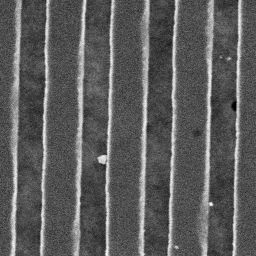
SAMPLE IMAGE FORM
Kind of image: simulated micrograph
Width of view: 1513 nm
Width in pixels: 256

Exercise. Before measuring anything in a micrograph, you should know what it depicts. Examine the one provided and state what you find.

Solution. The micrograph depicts lines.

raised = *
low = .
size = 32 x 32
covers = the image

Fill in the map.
**....*****...****....*****...**
**....*****...****....****....**
**....****....****....****....**
**....****....****....****....**
**....****....****....****....**
**....****....****....****....**
**....****....****....****....**
**....****....****....****....**
**....****....****....****....**
**....****....****....****....**
**....****....****....****....**
**....****....****....****....**
**....****....****....****....**
**....****....****....****....**
**...*****....****....****....**
**...*****....****....****....**
**...*****....****....****....**
**...*****....****....****....**
**...*****...*****....****...***
**...*****...*****...*****...***
**...*****...*****...*****...***
**...*****...*****...*****...***
**...*****...*****...*****...***
**...*****...*****...*****...***
**...*****...*****...*****...***
**...*****...*****...*****...***
**...*****...*****...*****...***
**...*****...*****...*****...***
**...*****...*****...*****...***
**...*****...*****...*****...***
**...*****...*****...*****...***
**...*****...*****...*****...***